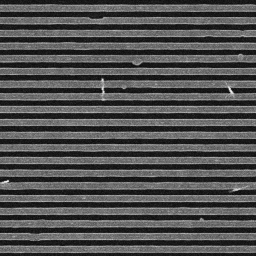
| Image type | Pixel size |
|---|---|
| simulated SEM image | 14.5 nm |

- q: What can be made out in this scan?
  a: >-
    parallel lines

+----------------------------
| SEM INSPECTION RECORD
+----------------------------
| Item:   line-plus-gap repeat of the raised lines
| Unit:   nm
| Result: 184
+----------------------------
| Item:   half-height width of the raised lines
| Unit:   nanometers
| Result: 88.7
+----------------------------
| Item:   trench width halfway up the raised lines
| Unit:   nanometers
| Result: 88.7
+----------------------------